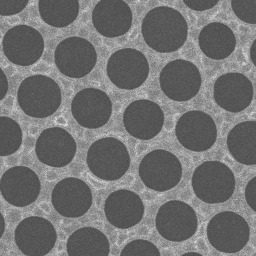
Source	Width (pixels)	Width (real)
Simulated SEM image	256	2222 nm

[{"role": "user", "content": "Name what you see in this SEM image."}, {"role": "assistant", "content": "a regular array of holes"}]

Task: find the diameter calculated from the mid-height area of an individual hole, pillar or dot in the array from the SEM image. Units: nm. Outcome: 366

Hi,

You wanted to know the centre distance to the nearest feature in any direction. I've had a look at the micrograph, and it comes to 460 nanometres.